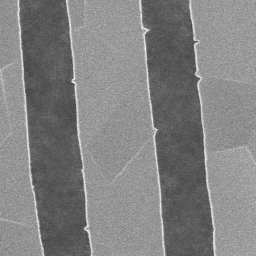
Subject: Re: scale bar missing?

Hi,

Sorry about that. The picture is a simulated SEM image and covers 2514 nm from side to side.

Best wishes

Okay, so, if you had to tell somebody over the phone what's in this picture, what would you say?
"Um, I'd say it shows one or a few lines or trenches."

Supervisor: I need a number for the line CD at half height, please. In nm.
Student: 723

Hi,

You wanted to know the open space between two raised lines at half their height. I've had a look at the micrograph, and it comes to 495 nm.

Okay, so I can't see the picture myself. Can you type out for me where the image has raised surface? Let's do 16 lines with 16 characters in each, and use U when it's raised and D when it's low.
UDDDUUUUUDDDUUUU
UDDDUUUUUDDDUUUU
UDDDUUUUUDDDUUUU
UDDDDUUUUDDDUUUU
UDDDDUUUUDDDUUUU
UUDDDUUUUDDDUUUU
UUDDDUUUUDDDDUUU
UUDDDUUUUUDDDUUU
UUDDDUUUUUDDDUUU
UUDDDUUUUUDDDUUU
UUDDDUUUUUDDDUUU
UUDDDUUUUUDDDUUU
UUDDDUUUUUDDDUUU
UUDDDUUUUUDDDUUU
UUDDDUUUUUDDDUUU
UUUDDDUUUUDDDUUU